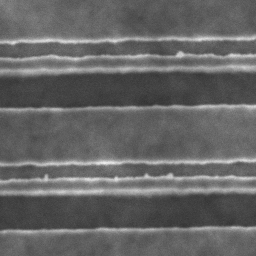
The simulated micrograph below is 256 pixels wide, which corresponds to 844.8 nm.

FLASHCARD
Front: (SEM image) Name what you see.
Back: lines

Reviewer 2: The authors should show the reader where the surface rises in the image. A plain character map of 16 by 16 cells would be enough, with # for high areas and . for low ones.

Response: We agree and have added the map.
################
################
################
################
................
................
................
################
################
################
################
################
................
................
################
################